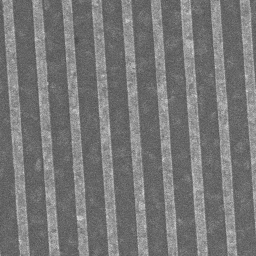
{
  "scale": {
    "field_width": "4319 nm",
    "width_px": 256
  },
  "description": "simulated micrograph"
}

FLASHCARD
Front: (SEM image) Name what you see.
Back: parallel lines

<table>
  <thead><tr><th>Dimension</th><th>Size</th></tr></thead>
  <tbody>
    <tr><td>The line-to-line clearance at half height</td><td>343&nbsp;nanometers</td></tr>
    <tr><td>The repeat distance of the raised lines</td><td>499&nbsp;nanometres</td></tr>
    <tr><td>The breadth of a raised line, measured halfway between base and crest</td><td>8.73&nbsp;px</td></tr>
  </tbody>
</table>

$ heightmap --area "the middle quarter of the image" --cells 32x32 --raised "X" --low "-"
-XX-----XX------XX-----XX-----XX
-XX-----XX------XX-----XX------X
-XX-----XX------XX-----XX------X
-XX-----XX------XX-----XX------X
-XX-----XX------XX-----XX------X
-XX------XX-----XX-----XX------X
-XX------XX-----XX-----XXX-----X
-XX------XX-----XX-----XXX-----X
-XX------XX-----XX------XX-----X
-XXX-----XX-----XX------XX-----X
-XXX-----XX-----XX------XX-----X
-XXX-----XX-----XX------XX-----X
--XX-----XX------XX-----XX-----X
--XX-----XX------XX-----XX-----X
--XX-----XX------XX-----XX-----X
--XX-----XX------XX-----XX------
--XX-----XX------XX-----XX------
--XX-----XX------XX-----XX------
--XX-----XX------XX-----XX------
--XX------X------XX-----XXX-----
--XX------XX-----XX-----XX------
--XX------XX-----XX-----XX------
--XX------XX-----XX-----XX------
--XXX-----XX-----XX------XX-----
--XXX-----XX-----XX------XX-----
--XXX-----XX-----XX------XX-----
--XXX-----XX-----XX------XX-----
---XX-----XX------XX-----XX-----
---XX-----XX------XX-----XX-----
---XX-----XX------XX-----XX-----
---XX-----XX------XX-----XX-----
---XX-----XX------XX-----XX-----